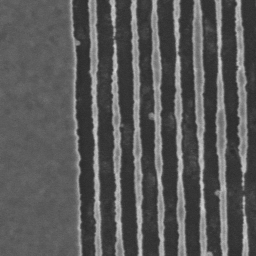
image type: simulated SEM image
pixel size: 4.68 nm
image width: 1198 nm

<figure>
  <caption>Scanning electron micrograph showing parallel lines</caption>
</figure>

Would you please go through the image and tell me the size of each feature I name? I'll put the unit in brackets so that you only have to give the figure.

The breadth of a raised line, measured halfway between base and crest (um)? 0.0263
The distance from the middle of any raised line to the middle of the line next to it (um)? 0.0981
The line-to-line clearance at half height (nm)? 74.8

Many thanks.